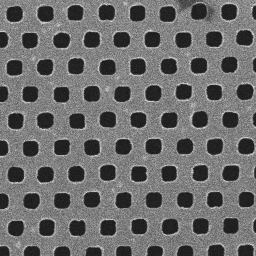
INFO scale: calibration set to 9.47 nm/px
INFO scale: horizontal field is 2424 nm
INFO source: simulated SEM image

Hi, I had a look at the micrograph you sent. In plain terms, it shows a regular array of holes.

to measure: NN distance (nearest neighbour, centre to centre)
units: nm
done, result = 284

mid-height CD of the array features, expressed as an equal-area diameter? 159 nanometers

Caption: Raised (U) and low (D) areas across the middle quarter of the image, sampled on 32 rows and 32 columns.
UDDDDUUUUDDDDUUUDDDDDUUUDDDDUUUU
UDDDDUUUUDDDDUUUDDDDDUUUDDDDUUUU
UUUDUUUUUDDDDUUUUDDDUUUUUDDUUUUU
UUUUUUUUUUUUUUUUUUUUUUUUUUUUUUUU
UUUUUUUUUUUUUUUUUUUUUUUUUUUUUUUU
UUUUUUUDUUUUUUUUUUUUUDDDUUUUDDDD
DUUUUDDDDUUUUDDDUUUUUDDDDUUUDDDD
DUUUUDDDDUUUUDDDDUUUDDDDDUUUDDDD
DUUUUDDDDUUUUDDDDUUUDDDDUUUUDDDD
DUUUUUUUUUUUUUDUUUUUUUUUUUUUUUUU
UUUUUUUUUUUUUUUUUUUUUUUUUUUUUUUU
UUUUUUUUUUUUUUUUUUUUUUUUUUUUUUUU
UUDDDUUUUDDDDUUUUDDDUUUUUDDDUUUU
UDDDDUUUUDDDDUUUUDDDDUUUDDDDUUUU
UDDDDUUUUDDDDUUUUDDDDUUUDDDDUUUU
UDDDDUUUUDDDDUUUUDDDUUUUUDDDUUUU
UUUUUUUUUUUUUUUUUUUUUUUUUUUUUUUU
UUUUUUUUUUUUUUUUUUUUUUUUUUUUUUUU
UUUUUUUUUUUUUUUUUUUUUUUUUUUUUUUU
DUUUUDDDDUUUUDDDDUUUDDDDUUUUUDDD
DDUUUDDDDUUUUDDDDUUUDDDDUUUUDDDD
DDUUUDDDDUUUUDDDDUUUUDDDUUUUDDDD
DUUUUUDDDUUUUDDDUUUUUUDUUUUUUDDU
UUUUUUUUUUUUUUUUUUUUUUUUUUUUUUUU
UUUUUUUUUUUUUUUUUUUUUUUUUUUUUUUU
UUUDUUUUUUDDDUUUUUDDUUUUUUDUUUUU
UDDDDUUUUDDDDUUUUDDDDUUUDDDDUUUU
UDDDDUUUUDDDDUUUUDDDDUUUDDDDUUUU
UDDDDUUUUDDDDUUUUDDDDUUUDDDDUUUU
UUUUUUUUUUUUUUUUUUDUUUUUUDDUUUUU
UUUUUUUUUUUUUUUUUUUUUUUUUUUUUUUU
UUUUUUUUUUUUUUUUUUUUUUUUUUUUUUUU